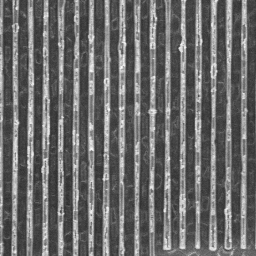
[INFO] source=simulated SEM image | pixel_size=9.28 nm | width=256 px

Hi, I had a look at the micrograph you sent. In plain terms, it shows parallel lines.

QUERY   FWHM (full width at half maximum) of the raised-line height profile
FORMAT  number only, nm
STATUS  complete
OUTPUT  41.8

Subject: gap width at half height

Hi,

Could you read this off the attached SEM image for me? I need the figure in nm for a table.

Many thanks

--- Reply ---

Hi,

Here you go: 98.6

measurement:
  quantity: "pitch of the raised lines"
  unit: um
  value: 0.142